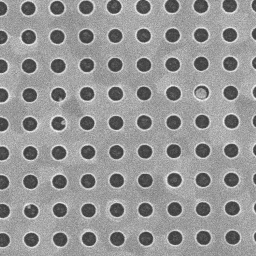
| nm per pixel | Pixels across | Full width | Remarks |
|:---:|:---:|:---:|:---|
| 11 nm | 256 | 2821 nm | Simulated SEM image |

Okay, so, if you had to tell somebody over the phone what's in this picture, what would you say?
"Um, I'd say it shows a regular array of holes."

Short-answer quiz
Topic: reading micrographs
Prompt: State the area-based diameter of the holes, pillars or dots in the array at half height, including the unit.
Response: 162 nanometres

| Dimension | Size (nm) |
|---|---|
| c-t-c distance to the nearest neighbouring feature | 313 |